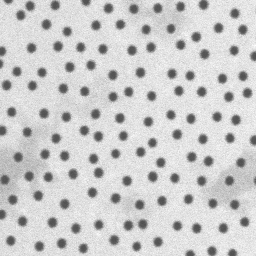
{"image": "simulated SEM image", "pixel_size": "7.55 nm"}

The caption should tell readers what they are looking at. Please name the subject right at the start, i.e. a regular array of holes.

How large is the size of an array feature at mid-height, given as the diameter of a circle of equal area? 9.97 pixels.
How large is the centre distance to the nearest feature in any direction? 152 nanometers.